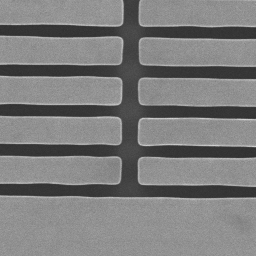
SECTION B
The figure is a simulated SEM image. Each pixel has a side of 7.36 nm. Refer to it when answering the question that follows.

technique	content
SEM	groups of lines, slits or small figures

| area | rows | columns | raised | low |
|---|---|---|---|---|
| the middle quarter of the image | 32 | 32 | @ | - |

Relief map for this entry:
-------------------------@@@@@@@
--------------------------------
--------------------------------
@@@@@@@@@@@@@@------------------
@@@@@@@@@@@@@@-----@@@@@@@@@@@@@
@@@@@@@@@@@@@@-----@@@@@@@@@@@@@
@@@@@@@@@@@@@@-----@@@@@@@@@@@@@
@@@@@@@@@@@@@@-----@@@@@@@@@@@@@
@@@@@@@@@@@@@@-----@@@@@@@@@@@@@
@@@@@@@@@@@@@@-----@@@@@@@@@@@@@
--------------------------------
--------------------------------
--------------------------------
@@@@@@@@@@@@@@------------------
@@@@@@@@@@@@@@-----@@@@@@@@@@@@@
@@@@@@@@@@@@@@-----@@@@@@@@@@@@@
@@@@@@@@@@@@@@-----@@@@@@@@@@@@@
@@@@@@@@@@@@@@-----@@@@@@@@@@@@@
@@@@@@@@@@@@@@-----@@@@@@@@@@@@@
@@@@@@@@@@@@@@-----@@@@@@@@@@@@@
--------------------------------
--------------------------------
--------------------------------
@@@@@@@@@@@@@@-----@@@@@--------
@@@@@@@@@@@@@@-----@@@@@@@@@@@@@
@@@@@@@@@@@@@@-----@@@@@@@@@@@@@
@@@@@@@@@@@@@@-----@@@@@@@@@@@@@
@@@@@@@@@@@@@@-----@@@@@@@@@@@@@
@@@@@@@@@@@@@@-----@@@@@@@@@@@@@
@@@@@@@@@@@@@@-----@@@@@@@@@@@@@
--------------------------------
--------------------------------